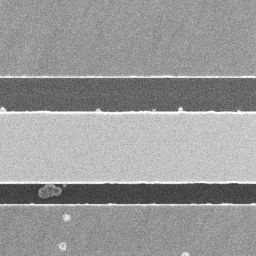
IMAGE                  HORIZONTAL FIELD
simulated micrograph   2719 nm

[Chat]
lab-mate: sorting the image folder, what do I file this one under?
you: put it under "lines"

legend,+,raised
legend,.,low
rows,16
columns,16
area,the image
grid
++++++++++++++++
++++++++++++++++
++++++++++++++++
++++++++++++++++
++++++++++++++++
................
................
++++++++++++++++
++++++++++++++++
++++++++++++++++
++++++++++++++++
................
................
++++++++++++++++
++++++++++++++++
++++++++++++++++